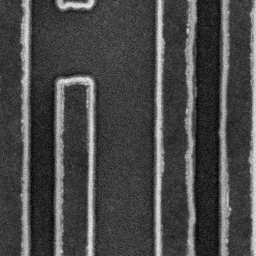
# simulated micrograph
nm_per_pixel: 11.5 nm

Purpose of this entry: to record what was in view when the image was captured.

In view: one or a few lines or trenches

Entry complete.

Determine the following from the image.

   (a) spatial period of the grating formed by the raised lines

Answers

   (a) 938 nanometers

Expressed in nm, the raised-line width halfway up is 358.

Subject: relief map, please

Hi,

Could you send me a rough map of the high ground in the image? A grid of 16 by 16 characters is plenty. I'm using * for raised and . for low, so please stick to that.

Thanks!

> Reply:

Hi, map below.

**........**..**
**........**..**
**........**..**
**........**..**
**........**..**
**..**....**..**
**..**....**..**
**..**....**..**
**..**....**..**
**..**....**..**
**..**....**..**
**..**....**..**
**..**....**..**
**..**....**..**
**..**....**..**
**..**....**..**